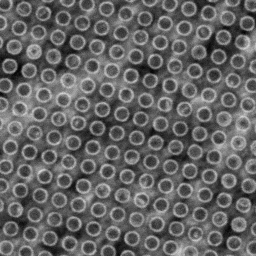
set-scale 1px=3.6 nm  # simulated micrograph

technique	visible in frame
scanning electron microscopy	a regular array of raised bodies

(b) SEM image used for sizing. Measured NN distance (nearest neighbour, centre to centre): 70.1 nm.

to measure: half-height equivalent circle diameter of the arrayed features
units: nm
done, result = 50.5